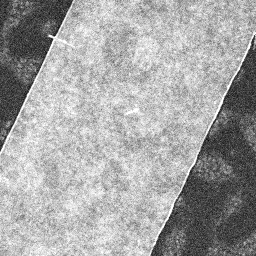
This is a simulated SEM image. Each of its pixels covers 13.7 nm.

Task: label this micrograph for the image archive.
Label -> one or a few lines or trenches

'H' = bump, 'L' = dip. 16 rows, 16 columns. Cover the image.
LLLLHHHHHHHHHHHH
LLLLHHHHHHHHHHHH
LLLHHHHHHHHHHHHH
LLLHHHHHHHHHHHHL
LLHHHHHHHHHHHHHL
LLHHHHHHHHHHHHLL
LHHHHHHHHHHHHHLL
LHHHHHHHHHHHHLLL
LHHHHHHHHHHHHLLL
HHHHHHHHHHHHLLLL
HHHHHHHHHHHHLLLL
HHHHHHHHHHHLLLLL
HHHHHHHHHHHLLLLL
HHHHHHHHHHHLLLLL
HHHHHHHHHHLLLLLL
HHHHHHHHHHLLLLLL